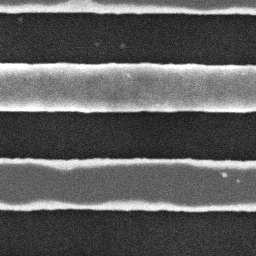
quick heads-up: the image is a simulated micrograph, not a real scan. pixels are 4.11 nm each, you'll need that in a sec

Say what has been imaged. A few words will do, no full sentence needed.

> lines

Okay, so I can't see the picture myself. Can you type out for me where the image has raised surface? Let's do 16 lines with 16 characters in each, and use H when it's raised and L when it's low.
HHHHHHHHHHHHHHHH
LLLLLLLLLLLLLLLL
LLLLLLLLLLLLLLLL
LLLLLLLLLLLLLLLL
HHHHHHHHHHHHHHHH
HHHHHHHHHHHHHHHH
HHHHHHHHHHHHHHHH
LLLLLLLLLLLLLLLL
LLLLLLLLLLLLLLLL
LLLLLLLLLLLLLLLL
HHHHHHHHHHHHHHHH
HHHHHHHHHHHHHHHH
HHHHHHHHHHHHHHHH
LLLLLLLLLLLLLLLL
LLLLLLLLLLLLLLLL
LLLLLLLLLLLLLLLL